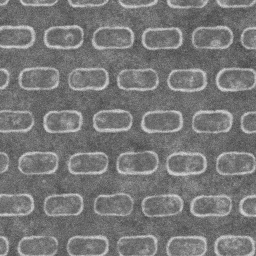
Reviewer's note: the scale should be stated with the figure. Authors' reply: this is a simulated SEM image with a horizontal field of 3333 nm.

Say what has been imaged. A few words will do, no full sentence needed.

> a regular array of raised bodies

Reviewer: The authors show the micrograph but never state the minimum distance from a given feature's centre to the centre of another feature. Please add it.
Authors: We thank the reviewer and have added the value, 625 nm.